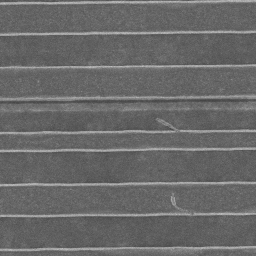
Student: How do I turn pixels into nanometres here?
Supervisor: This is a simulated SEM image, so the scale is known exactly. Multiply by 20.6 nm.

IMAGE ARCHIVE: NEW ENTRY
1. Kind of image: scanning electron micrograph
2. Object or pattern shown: wiring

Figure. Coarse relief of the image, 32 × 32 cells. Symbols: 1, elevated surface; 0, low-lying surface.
11111111111111111111111111111111
11111111111111111111111111111111
11111111111111111111111111111111
11111111111111111111111111111111
00000000000000000000000000000000
00000000000000000000000000000000
00000000000000000000000000000000
00000000000000000000000000000000
00000001111111111111111111111111
11111111111111111111111111111111
11111111111111111111111111111111
11111111111111111111111111111111
00000000000000000000000000000000
00000000000000000000000000000000
00000000000000000000000000000000
00000000000000000000000000000000
00000000000000000000011100111111
11111111111111111111111111111111
11111111111111111111111111111111
00000000000000000000000000000000
00000000000000000000000000000000
00000000000000000000000000000000
00000000000000000000000000000000
11111111111111111111111111111111
11111111111111111111111111111111
11111111111111111111111111111111
11111111111111111111111111111111
00000000000000000000000000000000
00000000000000000000000000000000
00000000000000000000000000000000
00000000000000000000000000000000
11111111111111111111111111111111